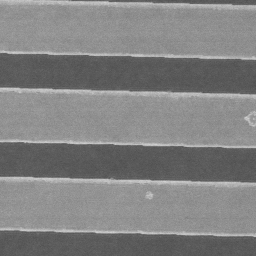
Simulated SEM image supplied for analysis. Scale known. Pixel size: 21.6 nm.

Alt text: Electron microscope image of lines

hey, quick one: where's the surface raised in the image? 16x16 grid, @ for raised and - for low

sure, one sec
@@@@@@@@@@@@@@@@
@@@@@@@@@@@@@@@@
@@@@@@@@@@@@@@@@
--------@@@@@@@@
----------------
----------------
@@@@@@@@@@@@@@@@
@@@@@@@@@@@@@@@@
@@@@@@@@@@@@@@@@
----------------
----------------
@@@@@@@@@@@@@@--
@@@@@@@@@@@@@@@@
@@@@@@@@@@@@@@@@
------@@@@@@@@@@
----------------